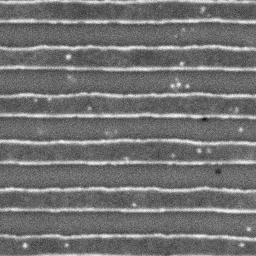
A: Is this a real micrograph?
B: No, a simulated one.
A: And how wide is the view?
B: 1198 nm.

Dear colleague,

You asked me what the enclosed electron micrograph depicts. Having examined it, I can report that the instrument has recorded lines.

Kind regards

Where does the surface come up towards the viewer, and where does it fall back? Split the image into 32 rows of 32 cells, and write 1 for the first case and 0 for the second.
11111111111111111111111111111111
11111111111111111111111111111111
11111111111111111111111111111111
00000000000000000000000000000000
00000000000000000000000000000000
00000000000000000000000000000000
11111111111111111111111111111111
11111111111111111111111111111111
00000000111111111111111111111111
00000000000000000000000000000000
00000000000000000000000000000000
00000000000000000000000000000000
11111111111111111111111111111111
11111111111111111111111111111111
00011111111111111101111111111111
00000000000000000000000000000000
00000000000000000000000000000000
00000000000000000000000000000000
11111111111111111111111111111111
11111111111111111111111111111111
00000000000000000000000000000000
00000000000000000000000000000000
00000000000000000000000000000000
00000000000000000000000001000000
11111111111111111111111111111111
11111111111111111111111111111111
00000000000000000000000000000000
00000000000000000000000000000000
00000000000000000000000000000000
10000111001111111111111111000000
11111111111111111111111111111111
11111111111111111111111111111111